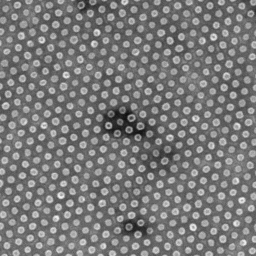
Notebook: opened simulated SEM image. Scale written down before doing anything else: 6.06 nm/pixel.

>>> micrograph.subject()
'a regular array of raised bodies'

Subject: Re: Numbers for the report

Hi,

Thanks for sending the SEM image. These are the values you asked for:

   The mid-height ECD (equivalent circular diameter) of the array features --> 39.9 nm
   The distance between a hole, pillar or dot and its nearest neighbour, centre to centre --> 70.8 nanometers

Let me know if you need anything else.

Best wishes